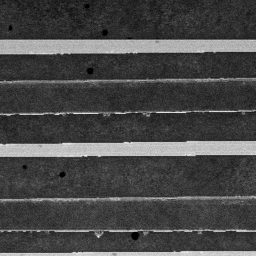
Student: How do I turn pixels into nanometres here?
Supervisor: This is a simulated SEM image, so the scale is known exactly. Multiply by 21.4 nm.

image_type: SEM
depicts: lines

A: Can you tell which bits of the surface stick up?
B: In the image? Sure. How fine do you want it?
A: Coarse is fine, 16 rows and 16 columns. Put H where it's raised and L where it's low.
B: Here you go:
LLLLLLLLLLLLLLLL
LLLLLLLLLLLLLLLL
LLLLLLLLLLLLLLLL
LLLLLLLLLLLLLLLL
LLLLLLLLLLLLLLLL
HHHHHHHHHHHHHHHH
HHHHHHHHHHHHHHHH
LLLLLLLLLLLLLLLL
LLLLLLLLLLLLLLLL
LLLLLLLLLLLLLLLL
LLLLLLLLLLLLLLLL
LLLLLLLLLLLLLLLL
LHHHHHHHHHHHHHHH
HHHHHHHHHHHHHHHH
LLLLLLLLLLLLLLLL
LLLLLLLLLLLLLLLL